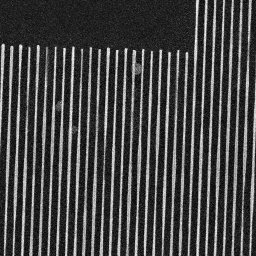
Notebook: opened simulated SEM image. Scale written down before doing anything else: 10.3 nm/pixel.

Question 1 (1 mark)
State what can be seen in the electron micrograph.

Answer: parallel lines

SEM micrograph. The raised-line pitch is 0.09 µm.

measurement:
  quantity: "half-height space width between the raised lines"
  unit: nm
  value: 73.1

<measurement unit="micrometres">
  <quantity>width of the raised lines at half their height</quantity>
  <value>0.0179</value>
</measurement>